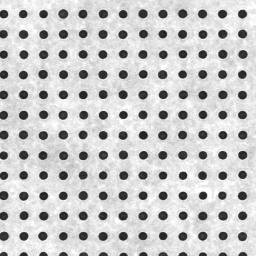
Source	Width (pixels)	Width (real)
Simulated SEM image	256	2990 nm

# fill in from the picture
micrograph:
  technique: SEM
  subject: a regular array of holes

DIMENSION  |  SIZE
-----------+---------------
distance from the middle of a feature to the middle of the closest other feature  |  0.229 micrometres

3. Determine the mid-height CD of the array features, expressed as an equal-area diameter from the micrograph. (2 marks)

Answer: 8.96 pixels